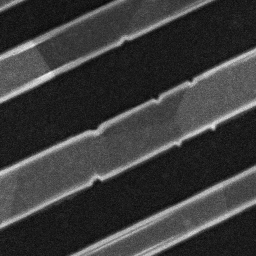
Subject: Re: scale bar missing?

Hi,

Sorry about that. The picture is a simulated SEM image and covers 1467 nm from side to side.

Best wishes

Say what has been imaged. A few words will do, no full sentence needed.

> one or a few lines or trenches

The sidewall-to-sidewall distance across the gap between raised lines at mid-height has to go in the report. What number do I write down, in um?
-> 0.355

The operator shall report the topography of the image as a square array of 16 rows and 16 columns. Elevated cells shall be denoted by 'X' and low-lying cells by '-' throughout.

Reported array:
------XXXXXX----
----XXXXXX------
--XXXXXX--------
XXXXXX---------X
XXXX---------XXX
XX---------XXXXX
---------XXXXXXX
-------XXXXXXX--
-----XXXXXXX----
---XXXXXXX------
-XXXXXXX--------
XXXXX---------XX
XXX---------XXXX
X---------XXXX--
--------XXXX----
------XXXX------